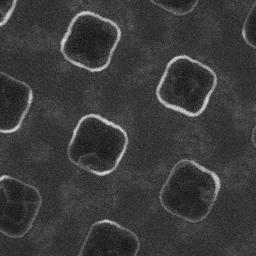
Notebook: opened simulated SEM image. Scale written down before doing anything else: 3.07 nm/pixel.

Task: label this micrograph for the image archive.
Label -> raised bodies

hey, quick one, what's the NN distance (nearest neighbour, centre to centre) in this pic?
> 319 nm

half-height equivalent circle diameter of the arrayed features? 177 nanometres